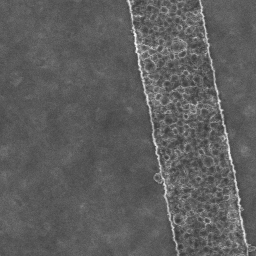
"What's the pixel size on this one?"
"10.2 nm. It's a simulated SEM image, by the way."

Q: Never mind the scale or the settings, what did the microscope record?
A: one or a few lines or trenches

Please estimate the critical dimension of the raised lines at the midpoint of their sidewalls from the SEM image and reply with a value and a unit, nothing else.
0.715 microns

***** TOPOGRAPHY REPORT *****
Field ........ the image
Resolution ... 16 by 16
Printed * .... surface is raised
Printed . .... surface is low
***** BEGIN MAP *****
........*****...
........*****...
........*****...
.........****...
.........****...
.........*****..
.........*****..
.........*****..
..........****..
..........****..
..........*****.
..........*****.
..........*****.
...........****.
...........****.
...........****.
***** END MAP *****